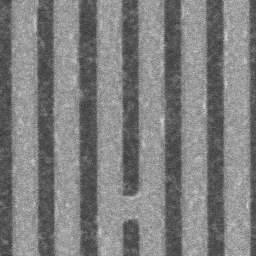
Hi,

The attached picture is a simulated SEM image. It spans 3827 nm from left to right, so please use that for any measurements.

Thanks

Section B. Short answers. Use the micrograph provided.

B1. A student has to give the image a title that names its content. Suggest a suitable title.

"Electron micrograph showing parallel lines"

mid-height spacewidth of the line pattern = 336 nanometers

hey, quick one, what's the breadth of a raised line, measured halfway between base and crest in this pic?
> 0.297 µm